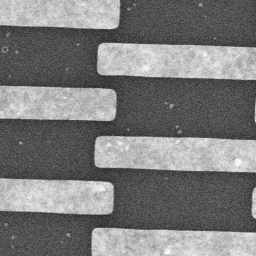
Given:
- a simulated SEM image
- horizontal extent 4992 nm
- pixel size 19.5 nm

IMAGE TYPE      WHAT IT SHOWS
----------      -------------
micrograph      groups of lines, slits or small figures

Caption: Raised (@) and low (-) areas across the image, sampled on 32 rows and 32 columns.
@@@@@@@@@@@@@@@-----------------
@@@@@@@@@@@@@@@-----------------
@@@@@@@@@@@@@@@-----------------
-----------@@@------------------
--------------------------------
-------------@@@----------------
------------@@@@@@@@@@@@@@@@@@@@
------------@@@@@@@@@@@@@@@@@@@@
------------@@@@@@@@@@@@@@@@@@@@
-----------------@@@@@@@@@@@@@@@
--------------------------------
@@@@@@@@@@@@@@------------------
@@@@@@@@@@@@@@------------------
@@@@@@@@@@@@@@------------------
@@@@@@@@@@@@@@------------------
--------------------------------
--------------------------------
------------@@@@@@@@@@@@@@@@@---
------------@@@@@@@@@@@@@@@@@@@@
------------@@@@@@@@@@@@@@@@@@@@
------------@@@@@@@@@@@@@@@@@@@@
------------------------------@@
@@@@----------------------------
@@@@@@@@@@@@@@------------------
@@@@@@@@@@@@@@------------------
@@@@@@@@@@@@@@------------------
------@@@@@@@@------------------
--------------------------------
--------------------------------
------------@@@@@@@@@@@@@@@@@@@@
------------@@@@@@@@@@@@@@@@@@@@
------------@@@@@@@@@@@@@@@@@@@@